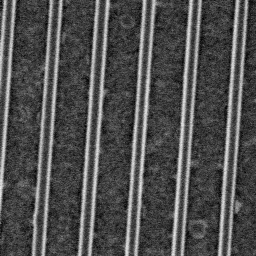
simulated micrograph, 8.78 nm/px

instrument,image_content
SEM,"parallel lines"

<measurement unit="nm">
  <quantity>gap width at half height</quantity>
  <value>315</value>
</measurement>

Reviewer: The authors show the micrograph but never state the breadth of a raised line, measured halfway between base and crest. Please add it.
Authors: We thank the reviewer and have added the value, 10.6 px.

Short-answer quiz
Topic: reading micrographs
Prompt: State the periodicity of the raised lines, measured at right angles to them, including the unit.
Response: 407 nm